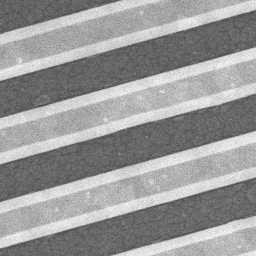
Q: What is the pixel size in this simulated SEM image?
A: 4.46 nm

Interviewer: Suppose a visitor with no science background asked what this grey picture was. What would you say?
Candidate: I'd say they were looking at one or a few lines or trenches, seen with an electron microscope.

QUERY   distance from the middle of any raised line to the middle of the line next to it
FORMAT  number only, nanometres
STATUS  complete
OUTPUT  361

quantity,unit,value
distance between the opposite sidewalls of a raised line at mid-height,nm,153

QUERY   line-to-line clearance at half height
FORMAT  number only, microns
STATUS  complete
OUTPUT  0.209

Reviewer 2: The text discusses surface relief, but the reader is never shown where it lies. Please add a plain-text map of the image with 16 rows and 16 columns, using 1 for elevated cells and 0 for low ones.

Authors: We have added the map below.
0000000111111110
0001111111110000
1111111100000000
1111000000000001
1000000000001111
0000000011111111
0000111111110000
0111111100000000
1111100000000000
1000000000000111
0000000001111111
0000011111111000
0011111111000000
1111110000000000
1110000000000011
0000000000111111